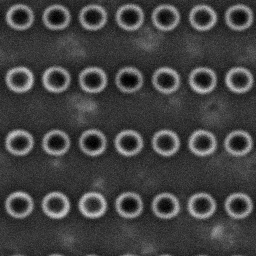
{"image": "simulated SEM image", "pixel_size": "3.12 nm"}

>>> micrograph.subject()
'a regular array of raised bodies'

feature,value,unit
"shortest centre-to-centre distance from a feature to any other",113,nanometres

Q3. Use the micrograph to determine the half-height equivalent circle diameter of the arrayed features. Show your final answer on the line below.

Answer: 74.1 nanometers